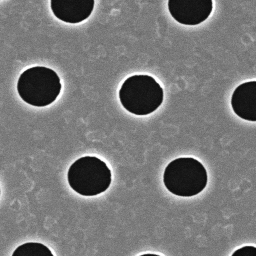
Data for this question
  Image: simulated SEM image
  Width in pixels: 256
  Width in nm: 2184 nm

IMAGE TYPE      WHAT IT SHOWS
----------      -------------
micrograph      holes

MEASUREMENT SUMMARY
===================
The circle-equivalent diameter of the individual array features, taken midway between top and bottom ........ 359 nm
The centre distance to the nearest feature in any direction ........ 0.808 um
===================